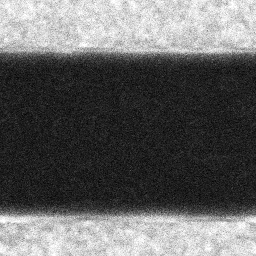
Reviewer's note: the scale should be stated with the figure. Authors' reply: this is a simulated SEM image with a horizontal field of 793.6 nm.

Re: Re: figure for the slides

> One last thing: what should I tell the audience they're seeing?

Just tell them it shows one or a few lines or trenches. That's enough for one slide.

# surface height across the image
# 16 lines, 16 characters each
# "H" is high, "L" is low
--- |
LLLLLLLLLLLLLLLL
LLLLLLLLLLLLLLLL
LLLLLLLLLLLLLLLL
HHHHHHHHHHHHHHHH
HHHHHHHHHHHHHHHH
HHHHHHHHHHHHHHHH
HHHHHHHHHHHHHHHH
HHHHHHHHHHHHHHHH
HHHHHHHHHHHHHHHH
HHHHHHHHHHHHHHHH
HHHHHHHHHHHHHHHH
HHHHHHHHHHHHHHHH
HHHHHHHHHHHHHHHH
HHHHHHHHHHHHHHHH
LLLLLLLLLLLLLLLL
LLLLLLLLLLLLLLLL